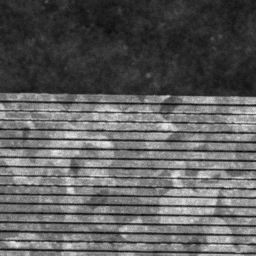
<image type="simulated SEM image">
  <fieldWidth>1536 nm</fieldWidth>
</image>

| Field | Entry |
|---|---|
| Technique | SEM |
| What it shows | parallel lines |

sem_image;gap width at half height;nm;17.2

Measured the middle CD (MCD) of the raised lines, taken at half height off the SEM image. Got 0.039 um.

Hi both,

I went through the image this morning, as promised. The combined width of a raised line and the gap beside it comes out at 0.0556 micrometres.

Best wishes